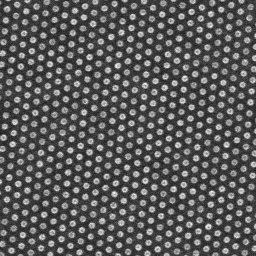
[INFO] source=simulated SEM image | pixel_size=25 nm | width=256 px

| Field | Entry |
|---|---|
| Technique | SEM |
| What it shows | a regular array of raised bodies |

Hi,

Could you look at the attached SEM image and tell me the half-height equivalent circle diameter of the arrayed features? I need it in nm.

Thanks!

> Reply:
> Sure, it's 141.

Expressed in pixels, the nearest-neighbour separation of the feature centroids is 11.